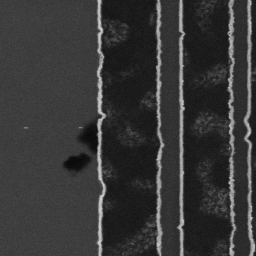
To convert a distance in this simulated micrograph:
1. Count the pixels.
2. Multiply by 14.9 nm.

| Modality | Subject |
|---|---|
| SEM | one or a few lines or trenches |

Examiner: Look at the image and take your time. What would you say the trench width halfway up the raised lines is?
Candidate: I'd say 0.296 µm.